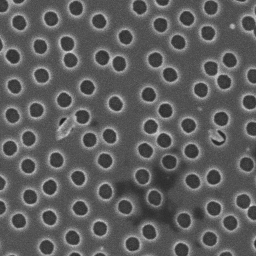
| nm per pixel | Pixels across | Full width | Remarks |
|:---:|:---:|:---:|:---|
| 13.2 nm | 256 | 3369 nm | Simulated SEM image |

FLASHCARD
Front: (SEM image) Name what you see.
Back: a regular array of holes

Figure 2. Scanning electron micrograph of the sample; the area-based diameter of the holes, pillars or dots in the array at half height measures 193 nanometres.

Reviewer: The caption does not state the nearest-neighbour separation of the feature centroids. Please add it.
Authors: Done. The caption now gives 24.7 px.